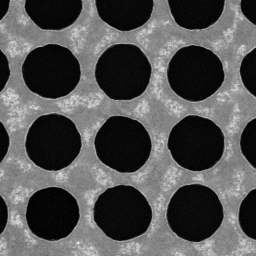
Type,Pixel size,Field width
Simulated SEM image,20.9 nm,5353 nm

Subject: a regular array of holes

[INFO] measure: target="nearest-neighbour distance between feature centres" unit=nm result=1460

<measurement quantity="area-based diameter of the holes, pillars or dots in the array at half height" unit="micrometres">1.18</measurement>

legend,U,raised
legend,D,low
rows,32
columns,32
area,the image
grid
DUUDDDDDDDUUDDDDDDDUUDDDDDDDUUDD
DUUDDDDDDDUUDDDDDDDUUDDDDDDDUUDD
UUUUDDDDDUUUUDDDDDDUUUDDDDDUUUUD
UUUUUDDDUUUUUUDDDUUUUUUDDDUUUUUU
UUUUUUUUUUUUUUUUUUUUUUUUUUUUUUUU
UUUUUUDUUUUUUUUDDUUUUUUUUUUUUUUU
UUUUDDDDDUUUUDDDDDUUUUDDDDUUUUUD
DUUDDDDDDDUUDDDDDDDUUDDDDDDUUUDD
DUUDDDDDDDUUDDDDDDDUUDDDDDDDUUDD
DUUDDDDDDDUUDDDDDDDUUDDDDDDDUUDD
DUUDDDDDDDUUDDDDDDUUUDDDDDDDUUDD
UUUUDDDDDUUUUDDDDDUUUUDDDDDUUUUD
UUUUUUUUUUUUUUUDUUUUUUUDDUUUUUUU
UUUUUUUUUUUUUUUUUUUUUUUUUUUUUUUU
UUUUUDDDUUUUUUDUUUUUUUUDDUUUUUUU
UUUUDDDDDUUUUDDDDDUUUUDDDDDUUUUD
DUUUDDDDDDUUDDDDDDUUUDDDDDDDUUDD
DUUDDDDDDDUUDDDDDDDUUDDDDDDDUUDD
DUUDDDDDDDUUDDDDDDDUUDDDDDDDUUDD
DUUUDDDDDDUUDDDDDDDUUUDDDDDDUUUD
UUUUDDDDDUUUUDDDDDUUUUDDDDDUUUUD
UUUUUUUUUUUUUUUDDUUUUUUUUUUUUUUU
UUUUUUUUUUUUUUUUUUUUUUUUUUUUUUUU
UUUUUUDDUUUUUUDDDUUUUUDDDDUUUUUU
UUUUDDDDDUUUDDDDDDUUUUDDDDDUUUUD
DUUDDDDDDDUUDDDDDDDUUDDDDDDDUUDD
DUUDDDDDDDUUDDDDDDDUUDDDDDDDUUDD
DUUDDDDDDDUUDDDDDDDUUDDDDDDDUUDD
DUUUDDDDDUUUUDDDDDDUUDDDDDDUUUDD
UUUUUDDDUUUUUUDDDUUUUUDDDDUUUUUD
UUUUUUUUUUUUUUUUUUUUUUUUUUUUUUUU
UUUUUUUUUUUUUUUUUUUUUUUUUUUUUUUU